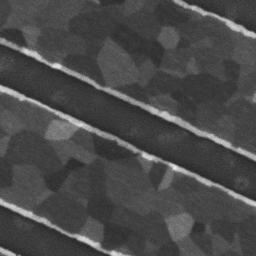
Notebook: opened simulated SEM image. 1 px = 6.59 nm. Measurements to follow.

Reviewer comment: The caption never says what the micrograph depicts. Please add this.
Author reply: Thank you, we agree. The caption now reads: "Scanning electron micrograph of one or a few lines or trenches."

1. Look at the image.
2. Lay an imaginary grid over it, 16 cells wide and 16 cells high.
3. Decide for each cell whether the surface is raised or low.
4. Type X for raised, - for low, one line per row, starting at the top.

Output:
XXXXXXXXXXXX----
XXXXXXXXXXXXXXX-
XXXXXXXXXXXXXXXX
--XXXXXXXXXXXXXX
----XXXXXXXXXXXX
------XXXXXXXXXX
XX-------XXXXXXX
XXXXX------XXXXX
XXXXXXX------XXX
XXXXXXXXX------X
XXXXXXXXXXX-----
XXXXXXXXXXXXX---
XXXXXXXXXXXXXXXX
--XXXXXXXXXXXXXX
----XXXXXXXXXXXX
------XXXXXXXXXX